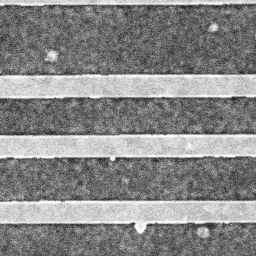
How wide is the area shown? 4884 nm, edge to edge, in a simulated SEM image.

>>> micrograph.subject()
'lines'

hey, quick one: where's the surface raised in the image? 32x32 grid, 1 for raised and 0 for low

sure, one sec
00111000000000000000000000000000
00000000000000000000000000000000
00000000000000000000000000000000
00000000000000000000000000000000
00000000000000000000000000000000
00000000000000000000000000000000
00000000000000000000000000000000
00000000000000000000000000000000
00000000000000000000000000000000
00000000000000100011111111111111
11111111111111111111111111111111
11111111111111111111111111111111
00000000000000000000000000000000
00000000000000000000000000000000
00000000000000000000000000000000
00000000000000000000000000000000
00000000000000000000000000000000
11111111111111111111111111111111
11111111111111111111111111111111
11111111111111111111111110001000
00000000000000000000000000000000
00000000000000000000000000000000
00000000000000000000000000000000
00000000000000000000000000000000
00000000000000000000000000000000
11111111111111111111111111111111
11111111111111111111111111111111
11111111111111111111111111111111
00000000000000000100000000000000
00000000000000000000000000000000
00000000000000000000000000000000
00000000000000000000000000000000